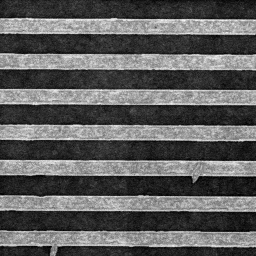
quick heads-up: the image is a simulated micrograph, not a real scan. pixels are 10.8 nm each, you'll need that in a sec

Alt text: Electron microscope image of parallel lines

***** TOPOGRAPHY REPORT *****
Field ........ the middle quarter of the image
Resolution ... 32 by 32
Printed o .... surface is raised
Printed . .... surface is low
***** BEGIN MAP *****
ooooooooooo.ooooooo.oooooooooooo
................................
................................
................................
................................
................................
................................
oooooooooooooooooooooooooooooooo
oooooooooooooooooooooooooooooooo
oooooooooooooooooooooooooooooooo
................................
................................
................................
................................
................................
ooooooooo.......................
oooooooooooo..oo.ooooooooooooooo
ooooooooooooo..ooooooooooooooooo
oooooooooooooooooooooooooooooooo
................................
................................
................................
................................
................................
oooooooooooooooooooooooooooooooo
.oooooo.oooooooooooooooooooooooo
ooooooo.oooooooooooooooooooooooo
oooooooooooooooooooooooooooooooo
................................
................................
................................
................................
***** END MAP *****